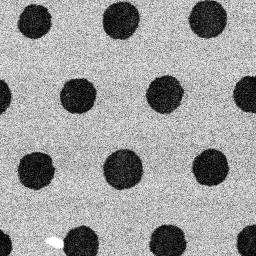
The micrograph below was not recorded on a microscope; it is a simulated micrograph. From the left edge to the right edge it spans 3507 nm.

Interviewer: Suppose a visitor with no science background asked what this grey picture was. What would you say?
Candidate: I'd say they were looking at holes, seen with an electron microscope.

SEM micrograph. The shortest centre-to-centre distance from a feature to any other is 1.18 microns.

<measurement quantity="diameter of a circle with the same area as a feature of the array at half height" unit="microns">0.516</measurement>